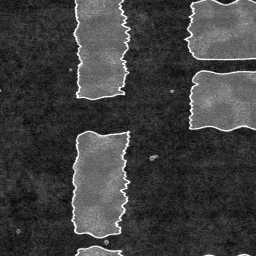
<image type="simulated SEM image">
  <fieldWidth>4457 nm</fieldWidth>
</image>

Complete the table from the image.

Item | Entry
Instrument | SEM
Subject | one or a few lines or trenches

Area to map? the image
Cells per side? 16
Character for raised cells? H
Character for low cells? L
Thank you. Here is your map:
HHHHHLLLHHHHLLLL
HHHHHLLLHHHHLLLL
HHHHHLLLHHHHLLLL
HHHHHLLLHHHHLLLL
HHHHHLLLHHHHHHHL
HHHHHLLLHHHHLLLL
HHHHHHHHHHHHLLLL
HHHHHHHHHHHHLLLL
HHHHHLLLHHHHHHHH
HHHHHLLLHHHHHHHH
HHHHHLLLHHHHHHHH
HHHHHLLLHHHHHHHH
HHHHHLLLHHHHHHHH
HHHHHLLLHHHHHHHH
HHHHHLLHHHHHHHHH
HHHHHHHHHHHHHHHH